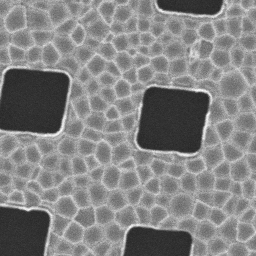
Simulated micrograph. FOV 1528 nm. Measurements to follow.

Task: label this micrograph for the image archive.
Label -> holes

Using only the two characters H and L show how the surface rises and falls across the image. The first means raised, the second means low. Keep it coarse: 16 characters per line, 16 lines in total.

HHHHHHHHHHLLLLHH
HHHHHHHHHHHHHHHH
HHHHHHHHHHHHHHHH
HHHHHHHHHHHHHHHH
HLLLHHHHHHHHHHHH
LLLLHHHHHLHHHHHH
LLLLHHHHHLLLLHHH
LLLLHHHHHLLLLHHH
HHHHHHHHHLLLLHHH
HHHHHHHHHHHLHHHH
HHHHHHHHHHHHHHHH
HHHHHHHHHHHHHHHH
HHHHHHHHHHHHHHHH
LLLHHHHHHHHHHHHH
LLLHHHHHLLLLHHHH
LLLHHHHHLLLLHHHH